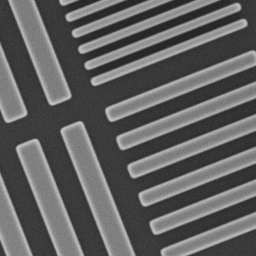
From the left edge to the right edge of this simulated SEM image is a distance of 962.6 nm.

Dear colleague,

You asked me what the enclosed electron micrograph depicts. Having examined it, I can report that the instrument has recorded groups of lines, slits or small figures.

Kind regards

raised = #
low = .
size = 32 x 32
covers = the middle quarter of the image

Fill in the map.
.....####......######...........
............######..............
..........#####.................
.......######................###
#......###.................#####
#.......................########
#.....................##########
##.................##########...
#................##########.....
..............###########.......
............##########..........
..........##########..........##
..........#######..........#####
...........####..........#######
......................##########
.####...............##########..
######...........##########.....
######.........##########.......
######.......##########.........
#######......#######..........##
.######.......####..........####
.######..................#######
.#######...............#########
..######............###########.
..#######.........##########....
..#######.......#########.......
...#######......#######.........
...#######......####...........#
....######..................####
....######................######
.....######............#########
.....######.........###########.